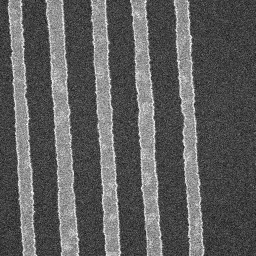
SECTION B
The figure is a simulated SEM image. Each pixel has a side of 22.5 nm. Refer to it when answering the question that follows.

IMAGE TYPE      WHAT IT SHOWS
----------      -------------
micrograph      parallel lines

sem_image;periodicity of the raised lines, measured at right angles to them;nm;936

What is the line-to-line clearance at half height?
0.625 µm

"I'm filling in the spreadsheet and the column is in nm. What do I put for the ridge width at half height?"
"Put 303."